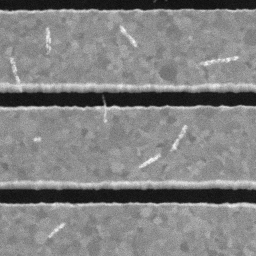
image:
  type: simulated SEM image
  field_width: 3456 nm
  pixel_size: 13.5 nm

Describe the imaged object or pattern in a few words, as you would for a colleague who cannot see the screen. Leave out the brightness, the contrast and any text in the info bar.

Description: lines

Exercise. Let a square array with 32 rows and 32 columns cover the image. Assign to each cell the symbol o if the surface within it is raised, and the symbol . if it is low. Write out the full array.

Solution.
................................
oooooooooooooooooooooooooooooooo
oooooooooooooooooooooooooooooooo
oooooooooooooooooooooooooooooooo
oooooooooooooooooooooooooooooooo
oooooooooooooooooooooooooooooooo
oooooooooooooooooooooooooooooooo
oooooooooooooooooooooooooooooooo
oooooooooooooooooooooooooooooooo
oooooooooooooooooooooooooooooooo
oooooooooooooooooooooooooooooooo
................................
................................
oooooooooooooooooooooooooooooooo
oooooooooooooooooooooooooooooooo
oooooooooooooooooooooooooooooooo
oooooooooooooooooooooooooooooooo
oooooooooooooooooooooooooooooooo
oooooooooooooooooooooooooooooooo
oooooooooooooooooooooooooooooooo
oooooooooooooooooooooooooooooooo
oooooooooooooooooooooooooooooooo
oooooooooooooooooooooooooooooooo
................................
................................
o..ooooooooooooooooooooooooooooo
oooooooooooooooooooooooooooooooo
oooooooooooooooooooooooooooooooo
oooooooooooooooooooooooooooooooo
oooooooooooooooooooooooooooooooo
oooooooooooooooooooooooooooooooo
oooooooooooooooooooooooooooooooo